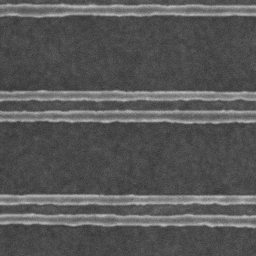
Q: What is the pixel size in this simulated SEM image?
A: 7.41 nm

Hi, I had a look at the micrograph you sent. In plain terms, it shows lines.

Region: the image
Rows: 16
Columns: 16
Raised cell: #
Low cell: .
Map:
################
................
................
................
................
................
################
################
................
................
................
................
################
################
................
................